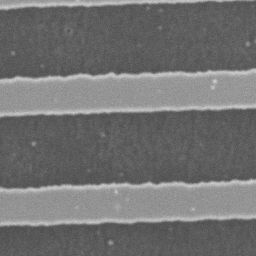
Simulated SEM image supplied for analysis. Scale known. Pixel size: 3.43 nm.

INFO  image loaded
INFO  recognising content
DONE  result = lines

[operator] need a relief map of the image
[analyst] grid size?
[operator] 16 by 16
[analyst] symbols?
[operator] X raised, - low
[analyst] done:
X---------------
----------------
----------------
----------------
-------------XXX
XXXXXXXXXXXXXXXX
XXXXXXXXXXXXXXXX
----------------
----------------
----------------
----------------
-------X-XXXXXXX
XXXXXXXXXXXXXXXX
XXXXXXXXXXXXXXXX
----------------
----------------